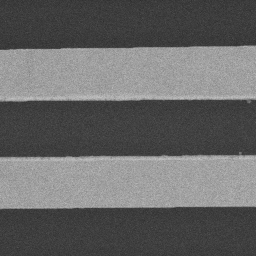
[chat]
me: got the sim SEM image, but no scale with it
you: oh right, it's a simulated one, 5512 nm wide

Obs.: lines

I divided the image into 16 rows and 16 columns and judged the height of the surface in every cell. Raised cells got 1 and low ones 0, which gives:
0000000000000000
0000000000000000
0000000000000000
1111111111111111
1111111111111111
1111111111111111
0000000000000000
0000000000000000
0000000000000000
0000000000000000
1111111111111111
1111111111111111
1111111111111111
0000000000000000
0000000000000000
0000000000000000